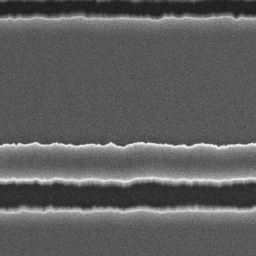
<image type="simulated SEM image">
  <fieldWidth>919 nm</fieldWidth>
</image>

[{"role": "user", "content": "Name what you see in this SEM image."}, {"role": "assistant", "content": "lines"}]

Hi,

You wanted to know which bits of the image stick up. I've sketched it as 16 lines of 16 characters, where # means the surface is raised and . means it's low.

................
################
################
################
################
################
################
################
################
################
################
................
................
################
################
################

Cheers